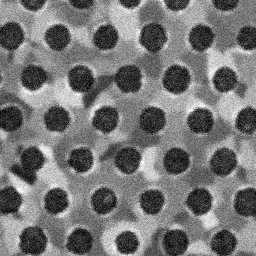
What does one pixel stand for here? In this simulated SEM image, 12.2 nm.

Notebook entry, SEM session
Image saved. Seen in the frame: a regular array of holes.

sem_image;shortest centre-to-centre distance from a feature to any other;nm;573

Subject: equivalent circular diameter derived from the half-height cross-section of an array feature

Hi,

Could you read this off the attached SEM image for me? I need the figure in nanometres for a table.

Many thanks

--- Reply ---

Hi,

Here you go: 341